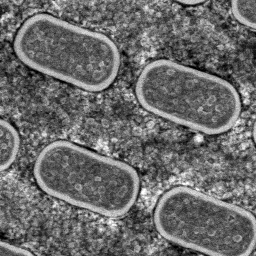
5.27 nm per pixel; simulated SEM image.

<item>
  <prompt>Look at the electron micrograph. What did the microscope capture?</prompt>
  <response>raised bodies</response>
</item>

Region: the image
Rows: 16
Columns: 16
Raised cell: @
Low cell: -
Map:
---------------@
--@@------------
-@@@@@@---------
-@@@@@@---------
---@@@@--@@@----
---------@@@@@--
---------@@@@@@-
-----------@@@@-
@---------------
@--@@@----------
--@@@@@@--------
---@@@@@@-------
----@@@@--@@@---
----------@@@@@@
----------@@@@@@
@-----------@@@@